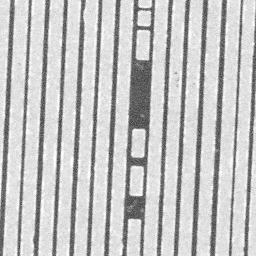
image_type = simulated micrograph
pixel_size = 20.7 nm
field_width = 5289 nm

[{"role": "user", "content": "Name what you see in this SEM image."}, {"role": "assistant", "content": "parallel lines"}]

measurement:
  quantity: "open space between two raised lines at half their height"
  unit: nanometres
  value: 111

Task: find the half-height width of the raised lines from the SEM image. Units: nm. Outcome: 250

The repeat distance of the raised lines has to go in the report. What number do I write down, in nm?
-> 361